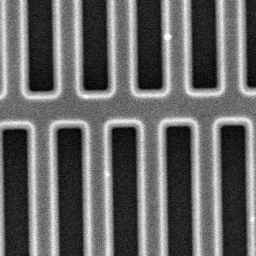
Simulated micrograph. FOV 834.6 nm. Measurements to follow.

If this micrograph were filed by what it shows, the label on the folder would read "groups of lines, slits or small figures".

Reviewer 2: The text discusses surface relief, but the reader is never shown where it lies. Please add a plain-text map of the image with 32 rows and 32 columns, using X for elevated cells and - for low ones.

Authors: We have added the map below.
XXX----XXX----XXX----XX----XXX--
XXX----XXX----XXX----XX----XXX--
XXX----XXX----XXX----XX----XXX--
XXX----XXX----XXX----XXX---XXX--
XXX----XXX----XXX----XXX---XXX--
XXX----XXX----XXX----XXX---XXX--
XXX----XXX----XXX----XXX---XXX--
XXX----XXX----XXX----XXX---XXX--
XXX----XXX----XXX----XXX---XXX--
XXX----XXX----XXX----XXX----XX--
XXX----XXX----XXX----XXX----XX--
XXXX---XXX---XXXX---XXXXXXXXXXXX
XXXXXXXXXXXXXXXXXXXXXXXXXXXXXXXX
XXXXXXXXXXXXXXXXXXXXXXXXXXXXXXXX
XXXXXXXXXXXXXXXXXXXXXXXXXXXXXXXX
XXXXXXXXXXXXXXXXXXXXX---XXXX---X
----XXX----XXX---XXX----XXX----X
----XXX----XXX---XXX----XXX----X
----XXX----XXX---XXX----XXX----X
----XXX----XXX---XXX----XXX----X
----XXX----XXX---XXX----XXX----X
----XXX----XXX---XXX----XXX----X
----XXX----XXX---XXX----XXX----X
----XXX----XXX----XX----XXX----X
----XXX----XXX----XXX---XXX----X
----XXX----XXX----XXX---XXX----X
----XXX----XXX----XXX---XXX----X
----XXX----XXX----XXX---XXX----X
----XXX----XXX----XXX---XXX----X
----XXX----XXX----XXX---XXX----X
----XXX----XXX----XXX----XX----X
----XXX----XXX----XXX----XX----X